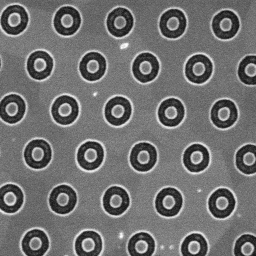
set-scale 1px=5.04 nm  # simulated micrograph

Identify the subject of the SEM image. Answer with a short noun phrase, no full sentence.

a regular array of ring-shaped grooves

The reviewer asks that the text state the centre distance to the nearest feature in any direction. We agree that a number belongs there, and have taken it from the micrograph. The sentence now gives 51.6 px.